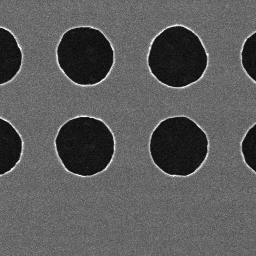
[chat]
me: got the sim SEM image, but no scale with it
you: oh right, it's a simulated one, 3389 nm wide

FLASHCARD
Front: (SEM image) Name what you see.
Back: holes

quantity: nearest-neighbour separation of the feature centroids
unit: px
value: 89.8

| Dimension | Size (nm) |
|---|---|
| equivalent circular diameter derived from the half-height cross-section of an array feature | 773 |